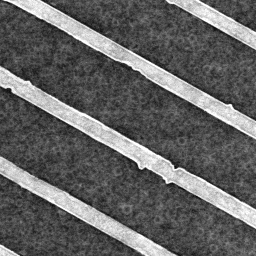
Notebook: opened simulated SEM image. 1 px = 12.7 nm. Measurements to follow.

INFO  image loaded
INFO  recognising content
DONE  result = one or a few lines or trenches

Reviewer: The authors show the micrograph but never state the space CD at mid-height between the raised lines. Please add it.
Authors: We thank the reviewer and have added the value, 802 nanometers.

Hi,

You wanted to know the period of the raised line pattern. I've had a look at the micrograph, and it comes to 0.99 um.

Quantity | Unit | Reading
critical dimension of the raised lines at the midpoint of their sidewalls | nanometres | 185